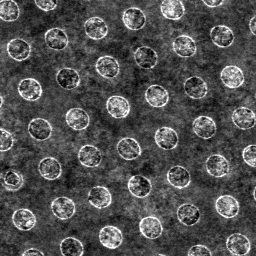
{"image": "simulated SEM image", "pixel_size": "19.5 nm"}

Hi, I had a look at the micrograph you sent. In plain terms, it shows a regular array of raised bodies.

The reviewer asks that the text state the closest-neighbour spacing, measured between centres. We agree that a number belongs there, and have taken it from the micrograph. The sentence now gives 768 nm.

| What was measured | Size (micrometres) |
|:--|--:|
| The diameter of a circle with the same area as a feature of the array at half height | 0.425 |